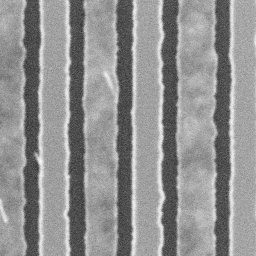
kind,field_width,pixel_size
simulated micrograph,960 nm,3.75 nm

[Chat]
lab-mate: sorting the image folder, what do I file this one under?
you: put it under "lines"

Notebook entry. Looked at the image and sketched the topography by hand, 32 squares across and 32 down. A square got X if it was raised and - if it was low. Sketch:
XXX--XXXX--XXXX--XXX--XXXXX--XXX
XXX--XXXX--XXX---XXX--XXXXX--XXX
XXX--XXXX--XXX---XXX--XXXXX--XXX
XXX--XXXX--XXX---XXX--XXXXX--XXX
XXX--XXXX--XXXX--XXX--XXXXX--XXX
XXX--XXXX--XXXX--XXX--XXXXX--XXX
XXX--XXXX--XXXX--XXX--XXXXX--XXX
XXX--XXXX--XXXX--XXX--XXXXX--XXX
XXX--XXX---XXX---XXX--XXXXX--XXX
XXX--XXXX--XXX---XXX--XXXXX--XXX
XXX--XXXX--XXXX--XXX--XXXXX--XXX
XXX--XXX---XXXX--XXX--XXXXX--XXX
XXX--XXXX-XXXXX--XXX--XXXXX--XXX
XXX--XXXX-XXXXX--XXX--XXXXX--XXX
XXX--XXXX--XXXX--XXX--XXXXX--XXX
XXX--XXX---XXXX--XXX--XXXXX--XXX
XXX--XXX---XXXX--XXX--XXXXX--XXX
XXX--XXX---XXX---XXX--XXXXX--XXX
XXX--XXX---XXX---XXX--XXXXX--XXX
XXX--XXXX--XXXX--XXX--XXXXX--XXX
XXX--XXX---XXXX--XXX--XXXXX--XXX
XXX--XXX---XXXX--XXX--XXXXX--XXX
XXX--XXXX--XXXX--XXX--XXXXX--XXX
XXX--XXXX--XXXX--XXX--XXXXX--XXX
XXX--XXX---XXXX--XXX--XXXXX--XXX
XXX--XXX---XXXX--XXX--XXXXX--XXX
XXX--XXX---XXXX--XXX--XXXXX--XXX
XXX--XXX---XXXX--XXX--XXXXX--XXX
XXX--XXX---XXXX--XXX--XXXXX--XXX
XXX--XXXX--XXXX--XXX--XXXXX--XXX
XXX--XXXX--XXXX--XXX--XXXXX--XXX
XXX--XXXX--XXX---XXX--XXXXX--XXX